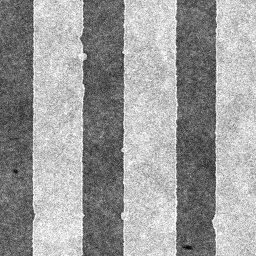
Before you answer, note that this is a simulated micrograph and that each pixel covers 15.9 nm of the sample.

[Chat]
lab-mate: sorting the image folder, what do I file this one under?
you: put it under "one or a few lines or trenches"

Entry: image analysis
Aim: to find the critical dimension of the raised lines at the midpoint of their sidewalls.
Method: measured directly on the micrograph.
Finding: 794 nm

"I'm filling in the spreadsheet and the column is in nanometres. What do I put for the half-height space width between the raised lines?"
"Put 660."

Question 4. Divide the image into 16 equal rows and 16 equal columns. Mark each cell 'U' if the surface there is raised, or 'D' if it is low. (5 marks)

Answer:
DDUUUDDDUUUDDDUU
DDUUUDDDUUUDDDUU
DDUUUDDDUUUDDDUU
DDUUUDDDUUUDDDUU
DDUUUDDDUUUDDDUU
DDUUUDDDUUUDDDUU
DDUUUDDDUUUDDDUU
DDUUUDDDUUUDDDUU
DDUUUDDDUUUDDDUU
DDUUUDDDUUUDDDUU
DDUUUDDDUUUDDDUU
DDUUUDDDUUUDDDUU
DDUUUDDDUUUDDDUU
DDUUUDDDUUUDDUUU
DDUUUDDDUUUDDUUU
DDUUUDDDUUUDDDUU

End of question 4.